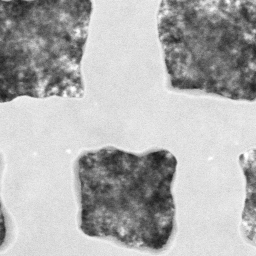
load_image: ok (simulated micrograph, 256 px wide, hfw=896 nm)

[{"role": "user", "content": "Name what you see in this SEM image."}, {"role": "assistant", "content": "holes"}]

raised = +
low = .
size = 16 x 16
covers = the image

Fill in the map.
......++++......
......++++......
.....+++++......
.....+++++......
.....+++++......
.....++++++.....
++++++++++++++++
++++++++++++++++
++++++++++++++++
+++++...+..++++.
+++++......++++.
+++++......++++.
+++++......++++.
+++++......++++.
.++++......++++.
++++++++..++++++